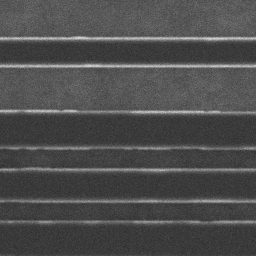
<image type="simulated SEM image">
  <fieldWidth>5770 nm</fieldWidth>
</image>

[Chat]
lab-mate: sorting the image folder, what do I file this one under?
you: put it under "lines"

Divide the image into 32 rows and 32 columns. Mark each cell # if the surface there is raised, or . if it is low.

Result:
................................
................................
................................
................................
................................
################################
################################
################################
................................
................................
................................
................................
................................
................................
################################
################################
################################
################################
.......#.##......#.##....#######
................................
................................
################################
################################
################################
################################
................................
................................
................................
################################
################################
################################
################################